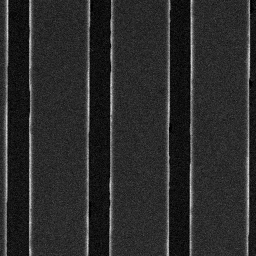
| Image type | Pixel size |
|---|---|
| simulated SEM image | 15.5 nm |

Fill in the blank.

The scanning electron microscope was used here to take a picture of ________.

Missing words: lines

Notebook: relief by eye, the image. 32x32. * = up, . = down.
*...*******...*******...*******.
*...*******...*******...*******.
*...*******...*******...*******.
*...*******...*******...*******.
*...*******...*******...*******.
*...*******...*******...*******.
*...*******...*******...*******.
*...*******...*******...*******.
*...*******...*******...*******.
*...*******...*******...*******.
*...*******...*******...*******.
*...*******...*******...*******.
*...*******...*******...*******.
*...*******...*******...*******.
*...*******...*******...*******.
*...*******...*******...*******.
*...*******...*******...*******.
*...*******...*******...*******.
*...*******...*******...*******.
*...*******...*******...*******.
*...*******...*******...*******.
*...*******...*******...*******.
*...*******...*******...*******.
*...*******...*******...*******.
*...*******...*******...*******.
*...*******...*******...*******.
*...*******...*******...*******.
*...*******...*******...*******.
*...*******...*******...*******.
*...*******...*******...*******.
*...*******...*******...*******.
*...*******...*******...*******.